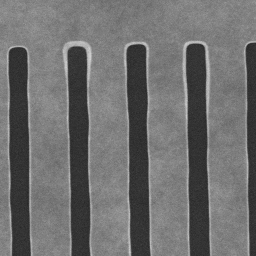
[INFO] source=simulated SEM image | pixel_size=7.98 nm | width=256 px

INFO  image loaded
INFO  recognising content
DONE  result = groups of lines, slits or small figures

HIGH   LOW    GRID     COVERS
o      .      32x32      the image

oooooooooooooooooooooooooooooooo
oooooooooooooooooooooooooooooooo
oooooooooooooooooooooooooooooooo
oooooooooooooooooooooooooooooooo
oooooooooooooooooooooooooooooooo
ooooooooo.ooooooo.oooooo.oooooo.
o..ooooo...ooooo..ooooo...ooooo.
o...oooo...ooooo..ooooo...ooooo.
o...oooo...ooooo..ooooo...ooooo.
o...oooo...ooooo..ooooo...ooooo.
o...oooo...ooooo..ooooo...ooooo.
o...oooo...ooooo..ooooo...ooooo.
o...oooo...ooooo..ooooo...ooooo.
o...oooo...ooooo..ooooo...ooooo.
o...oooo...ooooo..ooooo...ooooo.
o...oooo...ooooo..ooooo...ooooo.
o...ooooo..ooooo..ooooo...ooooo.
o...ooooo..ooooo..ooooo...ooooo.
o...ooooo..ooooo..ooooo...ooooo.
o...ooooo..ooooo...oooo...ooooo.
o...ooooo..ooooo...oooo...ooooo.
o...ooooo..ooooo...ooooo..ooooo.
o...ooooo..ooooo...oooo...ooooo.
o...ooooo..ooooo...oooo...ooooo.
o...ooooo..ooooo...ooooo..ooooo.
o...ooooo..ooooo...ooooo..ooooo.
o...ooooo..ooooo...ooooo..ooooo.
o...ooooo..ooooo...ooooo..ooooo.
o...ooooo..ooooo...ooooo..ooooo.
o...ooooo..ooooo...ooooo..ooooo.
o...ooooo..ooooo...ooooo..ooooo.
o...ooooo..ooooo...ooooo..ooooo.